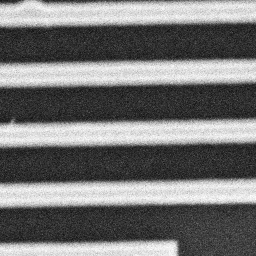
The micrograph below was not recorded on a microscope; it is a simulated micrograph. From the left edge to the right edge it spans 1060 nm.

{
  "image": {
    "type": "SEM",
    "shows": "parallel lines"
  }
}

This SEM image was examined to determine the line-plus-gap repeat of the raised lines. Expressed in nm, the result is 248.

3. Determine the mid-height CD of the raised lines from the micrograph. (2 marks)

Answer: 68.2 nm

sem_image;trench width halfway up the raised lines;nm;181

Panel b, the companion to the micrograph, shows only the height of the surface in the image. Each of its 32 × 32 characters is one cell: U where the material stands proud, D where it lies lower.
DDDUUDDDDDDDDDDDDDDDDDDDUUUUUUUU
UUUUUUUUUUUUUUUUUUUUUUUUUUUUUUUU
UUUUUUUUUUUUUUUUUUUUUUDDDDDDDDDD
DDDDDDDDDDDDDDDDDDDDDDDDDDDDDDDD
DDDDDDDDDDDDDDDDDDDDDDDDDDDDDDDD
DDDDDDDDDDDDDDDDDDDDDDDDDDDDDDDD
DDDDDDDDDDDDDDDDDDDDDDDDDDDDDDDD
DDDDDDDDDDDDDDDDDDDDDDDDDDDDDDDD
UUUUUUUUUUUUUUUUUUUUUUUUUUUUUUUU
UUUUUUUUUUUUUUUUUUUUUUUUUUUUUUUU
DDDDDDDDDDDDDDDDDDDDDDDDDDDDDDDD
DDDDDDDDDDDDDDDDDDDDDDDDDDDDDDDD
DDDDDDDDDDDDDDDDDDDDDDDDDDDDDDDD
DDDDDDDDDDDDDDDDDDDDDDDDDDDDDDDD
DDDDDDDDDDDDDDDDDDDDDDDDDDDDDDDD
DDDDDDDDDDUDDDDDDDDDDDUUUUUUUUUU
UUUUUUUUUUUUUUUUUUUUUUUUUUUUUUUU
UUUUUUUUUUUUUUUUUUUUUDDDDDDDDDDD
DDDDDDDDDDDDDDDDDDDDDDDDDDDDDDDD
DDDDDDDDDDDDDDDDDDDDDDDDDDDDDDDD
DDDDDDDDDDDDDDDDDDDDDDDDDDDDDDDD
DDDDDDDDDDDDDDDDDDDDDDDDDDDDDDDD
DDDDDDDDDDDDDDDDDDDDDDDDDDDDDDDD
UUUUUUUUUUUUUUUUUUUUUUUUUUUUUUUU
UUUUUUUUUUUUUUUUUUUUUUUUUUUUUUUU
DDDDDDDDDDDDDDDDDDDDDDDDDDDDDDDD
DDDDDDDDDDDDDDDDDDDDDDDDDDDDDDDD
DDDDDDDDDDDDDDDDDDDDDDDDDDDDDDDD
DDDDDDDDDDDDDDDDDDDDDDDDDDDDDDDD
DDDDDDDDDDDDDDDDDDDDDDDDDDDDDDDD
DDDDDDDDDDDDDDDDDDDDDDDDDDDDDDDD
UUUUUUUUUUUUUUUUUUUUUUDDDDDDDDDD